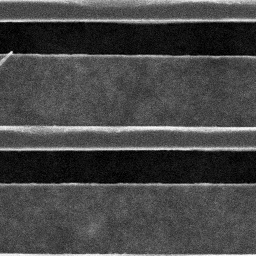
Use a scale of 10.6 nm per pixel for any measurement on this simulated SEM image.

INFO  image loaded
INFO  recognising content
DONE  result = lines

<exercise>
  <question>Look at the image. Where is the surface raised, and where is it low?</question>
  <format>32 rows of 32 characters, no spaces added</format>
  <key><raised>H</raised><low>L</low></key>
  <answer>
HHHHHHHHHHHHHHHHHHHHHHHHHHHHHHHH
HHHHHHHHHHHHHHHHHHHHHHHHHHHHHHHH
HHHHHHHHHHHHHHHHHHHHHHHHHHHHHHHH
LLLLLLLLLLLLLLLLLLLLLLLLLLLLLLLL
LLLLLLLLLLLLLLLLLLLLLLLLLLLLLLLL
LLLLLLLLLLLLLLLLLLLLLLLLLLLLLLLL
LLLLLLLLLLLLLLLLLLLLLLLLLLLLLLLL
HHHHHHHHHHHHHHHHHHHHHHHHHHHHHHHH
HHHHHHHHHHHHHHHHHHHHHHHHHHHHHHHH
HHHHHHHHHHHHHHHHHHHHHHHHHHHHHHHH
HHHHHHHHHHHHHHHHHHHHHHHHHHHHHHHH
HHHHHHHHHHHHHHHHHHHHHHHHHHHHHHHH
HHHHHHHHHHHHHHHHHHHHHHHHHHHHHHHH
HHHHHHHHHHHHHHHHHHHHHHHHHHHHHHHH
HHHHHHHHHHHHHHHHHHHHHHHHHHHHHHHH
HHHHHHHHHHHHHHHHHHHHHHHHHHHHHHHH
HHHHHHHHHHHHHHHHHHHHHHHHHHHHHHHH
HHHHHHHHHHHHHHHHHHHHHHHHHHHHHHHH
HHHHHHHHHHHHHHHHHHHHHHHHHHHHHHHH
LLLLLLLLLLLLLLLLLLLLLLLLLLLLLLLL
LLLLLLLLLLLLLLLLLLLLLLLLLLLLLLLL
LLLLLLLLLLLLLLLLLLLLLLLLLLLLLLLL
LLLLLLLLLLLLLLLLLLLLLLLLLLLLLLLL
HHHHHHHHHHHHHHHHHHHHHHHHHHHHHHHH
HHHHHHHHHHHHHHHHHHHHHHHHHHHHHHHH
HHHHHHHHHHHHHHHHHHHHHHHHHHHHHHHH
HHHHHHHHHHHHHHHHHHHHHHHHHHHHHHHH
HHHHHHHHHHHHHHHHHHHHHHHHHHHHHHHH
HHHHHHHHHHHHHHHHHHHHHHHHHHHHHHHH
HHHHHHHHHHHHHHHHHHHHHHHHHHHHHHHH
HHHHHHHHHHHHHHHHHHHHHHHHHHHHHHHH
HHHHHHHHHHHHHHHHHHHHHHHHHHHHHHHH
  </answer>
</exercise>